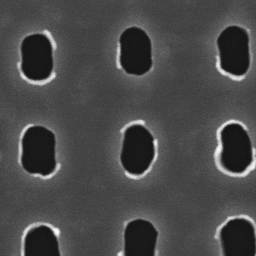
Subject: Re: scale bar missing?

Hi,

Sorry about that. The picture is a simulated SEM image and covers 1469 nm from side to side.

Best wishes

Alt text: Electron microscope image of holes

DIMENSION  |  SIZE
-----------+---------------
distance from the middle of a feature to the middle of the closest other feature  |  564 nanometers